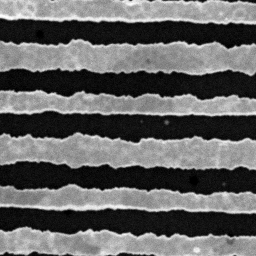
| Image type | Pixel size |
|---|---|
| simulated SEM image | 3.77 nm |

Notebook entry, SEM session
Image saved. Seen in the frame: lines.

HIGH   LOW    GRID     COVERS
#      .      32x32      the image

################################
################################
......##..######################
................................
................................
##.##...###....#...#####..#.....
################################
################################
################################
................................
................................
##..#...........................
#########################.######
################################
................................
................................
................................
###############...##.#######..##
################################
################################
#......#########################
................................
................................
##......##.....#................
################################
################################
............................####
................................
...#............................
####################.##...##....
################################
####.###########################